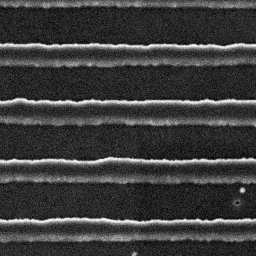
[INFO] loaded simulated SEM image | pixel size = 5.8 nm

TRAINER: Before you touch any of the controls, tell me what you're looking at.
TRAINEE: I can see lines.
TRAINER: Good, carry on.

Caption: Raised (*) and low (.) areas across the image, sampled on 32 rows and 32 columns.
********************************
................................
................................
................................
................................
................................
********************************
********************************
................................
................................
................................
................................
.***............................
********************************
********************************
...............................*
................................
................................
................................
................................
********************************
********************************
*...****************************
................................
................................
................................
................................
..**..********.........**..*.***
********************************
********************************
................................
................................